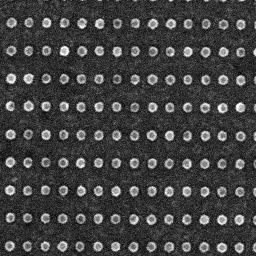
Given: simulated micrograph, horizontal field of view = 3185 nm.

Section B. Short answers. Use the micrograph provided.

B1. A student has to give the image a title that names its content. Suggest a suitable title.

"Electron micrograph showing a regular array of raised bodies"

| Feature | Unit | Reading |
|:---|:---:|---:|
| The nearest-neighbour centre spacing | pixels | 17.5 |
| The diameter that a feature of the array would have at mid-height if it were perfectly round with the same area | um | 0.101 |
